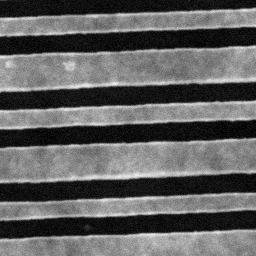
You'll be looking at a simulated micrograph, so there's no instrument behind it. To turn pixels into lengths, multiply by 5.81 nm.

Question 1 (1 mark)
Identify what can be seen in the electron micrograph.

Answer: lines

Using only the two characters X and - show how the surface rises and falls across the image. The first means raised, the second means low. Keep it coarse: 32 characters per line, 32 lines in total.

--------------------------------
-----------------------XXXXXXXXX
XXXXXXXXXXXXXXXXXXXXXXXXXXXXXXXX
XXXXXXXXXXXXXXXXXXXXXXXXXXX-----
X-------------------------------
--------------------------------
---------------XXXXXXXXXXXXXXXXX
XXXXXXXXXXXXXXXXXXXXXXXXXXXXXXXX
XXXXXXXXXXXXXXXXXXXXXXXXXXXXXXXX
XXXXXXXXXXXXXXXXXXXXXXXXXXXXXXXX
XXXXXXXXXXXXXXXXXXXXX-----------
--------------------------------
--------------------------------
----------XXXXXXXXXXXXXXXXXXXXXX
XXXXXXXXXXXXXXXXXXXXXXXXXXXXXXXX
XXXXXXXXXXXXXXXX----------------
--------------------------------
---------------------------XXXXX
XXXXXXXXXXXXXXXXXXXXXXXXXXXXXXXX
XXXXXXXXXXXXXXXXXXXXXXXXXXXXXXXX
XXXXXXXXXXXXXXXXXXXXXXXXXXXXXXXX
XXXXXXXXXXXXXXXXXXXXXXXXXXXXXXXX
XXXXXXXXX-----------------------
--------------------------------
-----------------------XXXXXXXXX
XXXXXXXXXXXXXXXXXXXXXXXXXXXXXXXX
XXXXXXXXXXXXXXXXXXXXXXXXX-X-----
--------------------------------
--------------------------------
-----------XXXXXXXXXXXXXXXXXXXXX
XXXXXXXXXXXXXXXXXXXXXXXXXXXXXXXX
XXXXXXXXXXXXXXXXXXXXXXXXXXXXXXXX